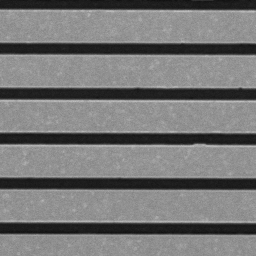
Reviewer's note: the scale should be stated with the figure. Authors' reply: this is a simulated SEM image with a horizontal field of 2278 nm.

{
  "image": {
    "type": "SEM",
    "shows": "parallel lines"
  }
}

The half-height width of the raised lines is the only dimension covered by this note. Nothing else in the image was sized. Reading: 33.9 px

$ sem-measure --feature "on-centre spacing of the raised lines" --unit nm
400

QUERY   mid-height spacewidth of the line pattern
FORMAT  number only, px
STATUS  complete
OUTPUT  11.6